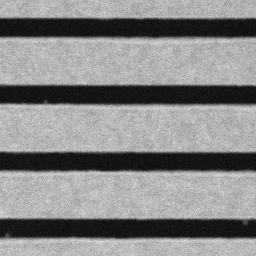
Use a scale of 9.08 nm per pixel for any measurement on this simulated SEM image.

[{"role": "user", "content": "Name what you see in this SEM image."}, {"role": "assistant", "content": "lines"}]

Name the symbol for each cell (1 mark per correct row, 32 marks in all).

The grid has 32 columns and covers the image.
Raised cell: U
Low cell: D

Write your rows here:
UUUUUUUUUUUUUUUUUUUUUUUUUUUUUUUU
UUUUUUUUUUUUUUUUUUUUUUUUUUUUUUUU
DDDDDDDDDDDDDDDDDDDDDDDDDDDDDDDD
DDDDDDDDDDDDDDDDDDDDDDDDDDDDDDDD
DDDDDDDDDDDDDDDDDDDDDDDDDDDDDDDD
UUUUUUUUUUUUUUUUUUUUUUUUUUUUUUUU
UUUUUUUUUUUUUUUUUUUUUUUUUUUUUUUU
UUUUUUUUUUUUUUUUUUUUUUUUUUUUUUUU
UUUUUUUUUUUUUUUUUUUUUUUUUUUUUUUU
UUUUUUUUUUUUUUUUUUUUUUUUUUUUUUUU
UUUUUUUUUUUUUUUUUUUUUUUUUUUUUUUU
DDDDDDDDDDDDDDDDDDDDDDDDDDDDDDDD
DDDDDDDDDDDDDDDDDDDDDDDDDDDDDDDD
UUUUUUUUUUUUUUUUUUUUUUUUUUUUUUUU
UUUUUUUUUUUUUUUUUUUUUUUUUUUUUUUU
UUUUUUUUUUUUUUUUUUUUUUUUUUUUUUUU
UUUUUUUUUUUUUUUUUUUUUUUUUUUUUUUU
UUUUUUUUUUUUUUUUUUUUUUUUUUUUUUUU
UUUUUUUUUUUUUUUUUUUUUUUUUUUUUUUU
DDDDDDDDDDDDDDDDDDDDDDDDDDDDDDDD
DDDDDDDDDDDDDDDDDDDDDDDDDDDDDDDD
UUUUUUUUUUUUUUUUUUUUUUUUUUUUUUUU
UUUUUUUUUUUUUUUUUUUUUUUUUUUUUUUU
UUUUUUUUUUUUUUUUUUUUUUUUUUUUUUUU
UUUUUUUUUUUUUUUUUUUUUUUUUUUUUUUU
UUUUUUUUUUUUUUUUUUUUUUUUUUUUUUUU
UUUUUUUUUUUUUUUUUUUUUUUUUUUUUUUU
DDDDDDDDDDDDDDDDDDDDDDDDDDDDDDDD
DDDDDDDDDDDDDDDDDDDDDDDDDDDDDDDD
DDDDDDDDDDDDDDDDDDDDDDDDDDDDDDDD
UUUUUUUUUUUUUUUUUUUUUUUUUUUUUUUU
UUUUUUUUUUUUUUUUUUUUUUUUUUUUUUUU